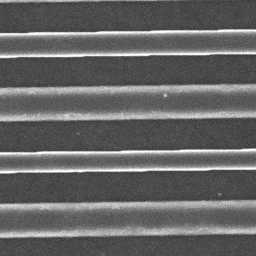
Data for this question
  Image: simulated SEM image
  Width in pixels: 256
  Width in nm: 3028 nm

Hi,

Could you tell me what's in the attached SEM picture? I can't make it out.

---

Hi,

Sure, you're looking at lines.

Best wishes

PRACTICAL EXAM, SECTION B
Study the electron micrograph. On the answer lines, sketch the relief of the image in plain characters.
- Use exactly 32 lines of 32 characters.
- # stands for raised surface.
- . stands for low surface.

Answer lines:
................................
................................
................................
................................
################################
################################
################################
................................
................................
................................
................................
################################
################################
################################
################................
................................
................................
................................
................................
################################
################################
................................
................................
................................
................................
............................####
################################
################################
################################
................................
................................
................................